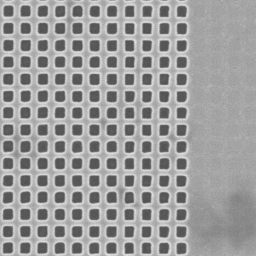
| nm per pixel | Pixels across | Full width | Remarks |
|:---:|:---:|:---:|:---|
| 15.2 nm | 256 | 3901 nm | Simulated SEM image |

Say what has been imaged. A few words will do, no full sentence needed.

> a regular array of holes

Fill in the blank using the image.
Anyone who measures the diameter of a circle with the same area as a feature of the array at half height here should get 0.184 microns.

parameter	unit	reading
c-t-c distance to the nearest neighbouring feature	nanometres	254